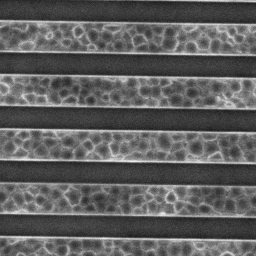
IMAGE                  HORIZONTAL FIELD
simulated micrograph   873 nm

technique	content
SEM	parallel lines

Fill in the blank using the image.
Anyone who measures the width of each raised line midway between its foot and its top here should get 104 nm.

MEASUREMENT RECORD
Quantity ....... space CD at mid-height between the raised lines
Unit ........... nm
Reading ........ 78.3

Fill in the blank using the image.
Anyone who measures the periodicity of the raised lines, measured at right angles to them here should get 0.184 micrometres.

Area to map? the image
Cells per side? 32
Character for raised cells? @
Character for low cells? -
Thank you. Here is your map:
--------------------------------
--------------------------------
--------------------------------
@@@@@@@@@@@@@@@@@@@@@@@@@@@@@@@@
@@@@@@@@@@@@@@@@@@@@@@@@@@@@@@@@
@@@@@@@@@@@@@@@@@@@@@@@@@@@@@@@@
------------@@@@@@@@@@@@@@@@@@@@
--------------------------------
--------------------------------
@@@@@@--------------------------
@@@@@@@@@@@@@@@@@@@@@@@@@@@@@@@@
@@@@@@@@@@@@@@@@@@@@@@@@@@@@@@@@
@@@@@@@@@@@@@@@@@@@@@@@@@@@@@@@@
-------------------------@@@@@@@
--------------------------------
--------------------------------
@@@@@@@@@@@@@@@@@@@-------------
@@@@@@@@@@@@@@@@@@@@@@@@@@@@@@@@
@@@@@@@@@@@@@@@@@@@@@@@@@@@@@@@@
@@@@@@@@@@@@@@@@@@@@@@@@@@@@@@@@
--------------------------------
--------------------------------
--------------------------------
@@@@@@@@@@@@@@@@@@@@@@@@@@@@@@@@
@@@@@@@@@@@@@@@@@@@@@@@@@@@@@@@@
@@@@@@@@@@@@@@@@@@@@@@@@@@@@@@@@
@@@@@@@@@@@@@@@@@@@@@@@@@@@@@@@@
--------------------------------
--------------------------------
--------------------------------
@@@@@@@@@@@@@@@@@@@@@@@@@@@@@@@@
@@@@@@@@@@@@@@@@@@@@@@@@@@@@@@@@